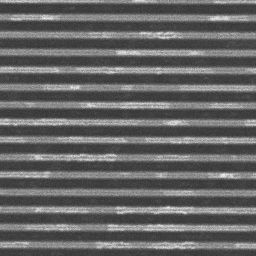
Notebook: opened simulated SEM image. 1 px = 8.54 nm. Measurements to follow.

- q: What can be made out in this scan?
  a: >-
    parallel lines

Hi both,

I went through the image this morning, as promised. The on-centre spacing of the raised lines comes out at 150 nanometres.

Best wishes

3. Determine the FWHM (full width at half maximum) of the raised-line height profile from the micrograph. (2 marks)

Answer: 56.6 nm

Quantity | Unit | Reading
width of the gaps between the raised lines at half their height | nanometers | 96.1